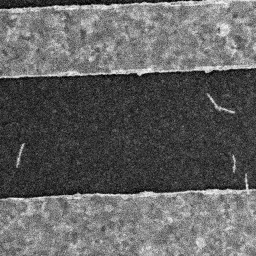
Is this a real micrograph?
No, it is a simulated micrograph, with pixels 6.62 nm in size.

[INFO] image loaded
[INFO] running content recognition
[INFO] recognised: one or a few lines or trenches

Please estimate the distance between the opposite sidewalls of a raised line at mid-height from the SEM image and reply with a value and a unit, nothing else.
449 nm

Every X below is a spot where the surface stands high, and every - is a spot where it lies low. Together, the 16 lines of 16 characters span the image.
--XXXXXXXXXXXXXX
XXXXXXXXXXXXXXXX
XXXXXXXXXXXXXXXX
XXXXXXXXXXXXXXXX
XXXXXXXXX-------
----------------
----------------
----------------
----------------
----------------
----------------
----------------
XXXXXXXXXXXXXXXX
XXXXXXXXXXXXXXXX
XXXXXXXXXXXXXXXX
XXXXXXXXXXXXXXXX